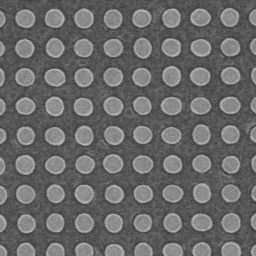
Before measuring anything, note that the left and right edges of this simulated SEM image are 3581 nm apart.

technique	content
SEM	a regular array of raised bodies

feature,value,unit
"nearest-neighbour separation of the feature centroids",402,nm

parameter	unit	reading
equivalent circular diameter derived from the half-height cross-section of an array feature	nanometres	252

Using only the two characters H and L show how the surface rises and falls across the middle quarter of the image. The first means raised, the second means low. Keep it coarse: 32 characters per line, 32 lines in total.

LLLLLLLLLLLLLLLLLLLLLLLLLLLLLLLL
LLLLHHLLLLLHHHLLLLHHHLLLLHHHHLLL
LLLHHHHLLLHHHHLLLLHHHLLLLHHHHLLL
LLLHHHHLLLHHHHLLLHHHHLLLLHHHHLLL
LLLHHHHLLLHHHHLLLLHHHLLLLHHHHLLL
LLLLLLLLLLLLLLLLLLLHLLLLLLLLLLLL
LLLLLLLLLLLLLLLLLLLLLLLLLLLLLLLL
LLLLLLLLLLLLLLLLLLLLLLLLLLLLLLLL
LLLLLLLLLLLHHLLLLLHHHLLLLLHHLLLL
LLLHHHHLLLHHHHLLLLHHHHLLLHHHHLLL
LLLHHHHLLLHHHHHLLLHHHHLLLHHHHLLL
LLLHHHHLLLHHHHLLLLHHHHLLLHHHHLLL
LLLLHHLLLLLHHHLLLLLHHLLLLLLLLLLL
LLLLLLLLLLLLLLLLLLLLLLLLLLLLLLLL
LLLLLLLLLLLLLLLLLLLLLLLLLLLLLLLL
LLLLLLLLLLLLLLLLLLLLLLLLLLLLLLLL
LLLHHHHLLLLHHHLLLLHHHLLLLHHHHLLL
LLLHHHHLLLHHHHHLLHHHHHLLHHHHHLLL
LLLHHHHLLLHHHHHLLHHHHHLLLHHHHLLL
LLLHHHHLLLLHHHLLLLHHHLLLLLHHLLLL
LLLLLLLLLLLLLLLLLLLLLLLLLLLLLLLL
LLLLLLLLLLLLLLLLLLLLLLLLLLLLLLLL
LLLLLLLLLLLLLLLLLLLLLLLLLLLLLLLL
LLLLHHHLLLHHHHLLLLHHHLLLLLHHHLLL
LLLHHHHLLLHHHHHLLHHHHHLLLHHHHLLL
LLLHHHHLLLHHHHHLLHHHHHLLLHHHHLLL
LLLLHHHLLLLHHHLLLLHHHLLLLLHHHLLL
LLLLLLLLLLLLLLLLLLLLLLLLLLLLLLLL
LLLLLLLLLLLLLLLLLLLLLLLLLLLLLLLL
LLLLLLLLLLLLLLLLLLLLLLLLLLLLLLLL
LLLLHHLLLLLLHLLLLLLHHLLLLLHHLLLL
LLLHHHHLLLLHHHLLLLHHHHLLLHHHHLLL